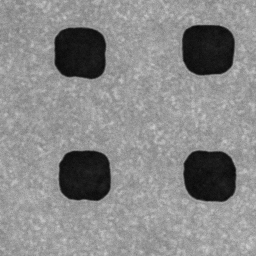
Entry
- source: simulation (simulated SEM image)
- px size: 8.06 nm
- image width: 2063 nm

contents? holes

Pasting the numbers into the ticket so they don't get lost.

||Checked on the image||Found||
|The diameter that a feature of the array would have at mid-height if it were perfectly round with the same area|0.439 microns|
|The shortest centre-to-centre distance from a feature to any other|1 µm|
